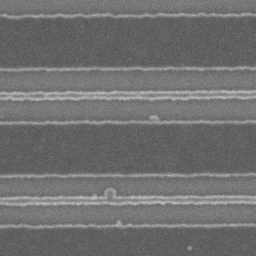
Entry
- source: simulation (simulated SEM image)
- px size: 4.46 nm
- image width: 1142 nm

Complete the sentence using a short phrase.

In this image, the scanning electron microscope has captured lines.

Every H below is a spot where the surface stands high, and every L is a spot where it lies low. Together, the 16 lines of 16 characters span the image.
LLLLLLLLLLLLLLLL
HHHHHHHHHHHHHHHH
HHHHHHHHHHHHHHHH
HHHHHHHHHHHHHHHH
LLLLLLLLLLLLLLLL
LLLLLLLLLLLLLLLL
LLLLLLLLLLLLLLLL
LLLLLLLLLLLLLLLL
HHHHHHHHHHHHHHHH
HHHHHHHHHHHHHHHH
HHHHHHHHHHHHHHHH
LLLLLLLLLLLLLLLL
LLLLLLLLLLLLLLLL
LLLLLLLLLLLLLLLL
HHHHHHHHHHHHHHHH
HHHHHHHHHHHHHHHH